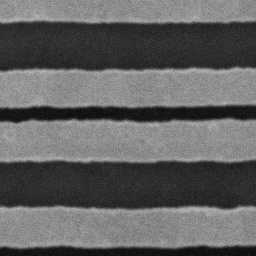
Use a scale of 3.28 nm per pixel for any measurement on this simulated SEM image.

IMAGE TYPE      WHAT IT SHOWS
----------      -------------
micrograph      lines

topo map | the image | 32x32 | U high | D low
UUUUUUUUUUUUUUUUUUUUUUUUUUUUUUUU
UUUUUUUUUUUUUUUUUUUUUUUUUUUUUUUU
UUUUUDUUUUUUUUUUUUUUUUUUUUUUUUUU
DDDDDDDDDDDDDDDDDDDDDDDDDDDDDDDD
DDDDDDDDDDDDDDDDDDDDDDDDDDDDDDDD
DDDDDDDDDDDDDDDDDDDDDDDDDDDDDDDD
DDDDDDDDDDDDDDDDDDDDDDDDDDDDDDDD
DDDDDDDDDDDDDDDDDDDDDDDDDDDDDDDD
DDDDDDDDDDDDDDDDDDDDDDDDDDDDDDDD
UUUUUUUUUUUUUUUUUUUUUUUUUUUUUUUU
UUUUUUUUUUUUUUUUUUUUUUUUUUUUUUUU
UUUUUUUUUUUUUUUUUUUUUUUUUUUUUUUU
UUUUUUUUUUUUUUUUUUUUUUUUUUUUUUUU
DDDDDDDDDDDDDDDDDDDDDDDDDDDDDDDD
DDDDDDDDDDDDDDDDDDDDDDDDDDDDDDDD
UUUUUUUUUUUUUUUUUUUUUUUUUUUUUUUU
UUUUUUUUUUUUUUUUUUUUUUUUUUUUUUUU
UUUUUUUUUUUUUUUUUUUUUUUUUUUUUUUU
UUUUUUUUUUUUUUUUUUUUUUUUUUUUUUUU
UUUUUUUUUUUUUUUUUUUUUUUUUUUUUUUU
DDDDDDDDDDDDDDDDDDDDDDDDDDDDDDDD
DDDDDDDDDDDDDDDDDDDDDDDDDDDDDDDD
DDDDDDDDDDDDDDDDDDDDDDDDDDDDDDDD
DDDDDDDDDDDDDDDDDDDDDDDDDDDDDDDD
DDDDDDDDDDDDDDDDDDDDDDDDDDDDDDDD
DDDDDDDDDDDDDDDDDDDDDDDDDDDDDDDD
UUUUUUUUUUUUUUUUUUUUUUUUUUUUUUUU
UUUUUUUUUUUUUUUUUUUUUUUUUUUUUUUU
UUUUUUUUUUUUUUUUUUUUUUUUUUUUUUUU
UUUUUUUUUUUUUUUUUUUUUUUUUUUUUUUU
UUUUUUUUUUUUUUUUUUUUUUUUUUUUUUUU
DDDDDDDDDDDDDDDDDDDDDDDDDDDDDDDD